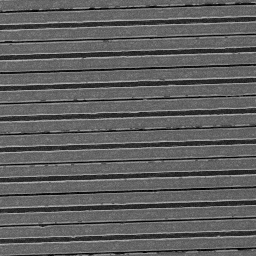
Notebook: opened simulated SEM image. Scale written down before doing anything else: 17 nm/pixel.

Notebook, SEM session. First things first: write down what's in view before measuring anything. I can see parallel lines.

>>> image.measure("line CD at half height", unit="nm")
191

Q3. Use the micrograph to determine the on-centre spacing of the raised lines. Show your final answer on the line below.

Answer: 0.261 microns